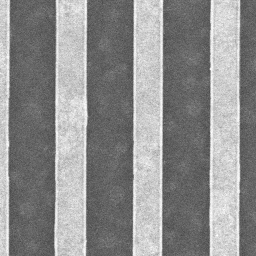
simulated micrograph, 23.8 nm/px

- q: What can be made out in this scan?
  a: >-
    one or a few lines or trenches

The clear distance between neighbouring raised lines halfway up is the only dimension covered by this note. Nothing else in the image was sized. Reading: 1160 nanometres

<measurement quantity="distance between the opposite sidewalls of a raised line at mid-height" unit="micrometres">0.651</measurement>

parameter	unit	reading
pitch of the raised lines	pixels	77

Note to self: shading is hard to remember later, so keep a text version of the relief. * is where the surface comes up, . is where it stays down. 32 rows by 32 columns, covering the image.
*......****......***.......***..
*......****......***.......***..
*......****......***.......***..
*......****......***.......***..
*......****......***.......***..
*......****......***.......***..
*......****......***.......***..
*......****......***.......***..
*......****......***......****..
*......****......***......****..
*......****......***......****..
*......****......***......****..
*......****......***......****..
*......****......***......****..
*......****......***......****..
*......****......***......****..
*......****......***......****..
*......****......***......****..
*......****......***......****..
*......****......***......****..
*......****......***......****..
*......****......***......****..
*......****......***......****..
*......****......***......****..
*......****......***......****..
*......****......***......****..
*......****......***......****..
*......****......***......****..
*......****......***......****..
*......****......***......****..
*......****......***......****..
*......****......***......****..